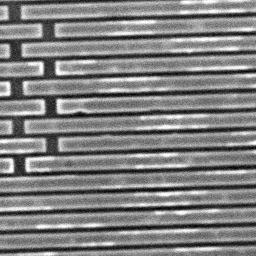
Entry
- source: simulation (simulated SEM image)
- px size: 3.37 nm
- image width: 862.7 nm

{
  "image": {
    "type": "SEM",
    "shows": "parallel lines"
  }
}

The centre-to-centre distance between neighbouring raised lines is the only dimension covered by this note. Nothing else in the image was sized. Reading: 0.0643 micrometres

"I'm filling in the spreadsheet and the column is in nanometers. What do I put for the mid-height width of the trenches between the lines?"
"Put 19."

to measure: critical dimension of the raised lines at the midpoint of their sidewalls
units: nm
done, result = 44.6